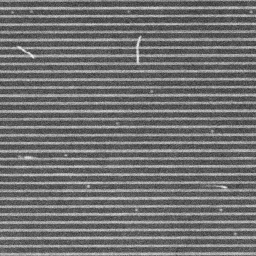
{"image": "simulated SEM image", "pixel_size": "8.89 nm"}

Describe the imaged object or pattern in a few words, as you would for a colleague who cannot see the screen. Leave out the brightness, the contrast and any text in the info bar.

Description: parallel lines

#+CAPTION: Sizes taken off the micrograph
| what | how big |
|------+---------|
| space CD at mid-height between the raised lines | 54.4 nanometres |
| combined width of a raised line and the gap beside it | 70.4 nm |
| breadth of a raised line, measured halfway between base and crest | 14.4 nm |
